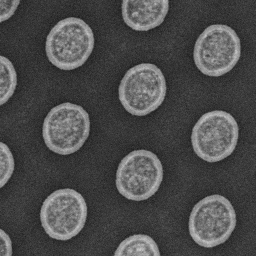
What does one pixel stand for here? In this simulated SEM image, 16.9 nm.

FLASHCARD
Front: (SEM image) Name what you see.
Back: a regular array of raised bodies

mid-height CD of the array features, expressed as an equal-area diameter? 44.7 pixels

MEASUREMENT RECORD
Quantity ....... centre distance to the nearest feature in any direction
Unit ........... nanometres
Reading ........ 1430